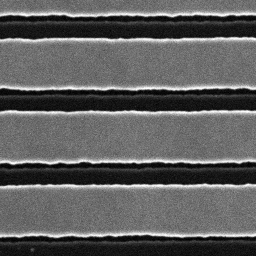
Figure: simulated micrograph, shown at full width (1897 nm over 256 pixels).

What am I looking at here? lines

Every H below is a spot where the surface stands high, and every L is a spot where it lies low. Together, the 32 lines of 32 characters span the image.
HHHHHHHHHHHHHHHHHHHHHHHHHHHHHHHH
HHHHHHHHHHHHHHHHHHHHHHHHHHHHHHHH
LLLLLLLLLLLLLLLLLLLLLLLLLLLLLLLL
LLLLLLLLLLLLLLLLLLLLLLLLLLLLLLLL
LLLLLLLLLLLLLLLLLLLLLLLLLLLLLLLL
HHHHHHHHHHHHHHHHHHHHHHHHHHHHHHHH
HHHHHHHHHHHHHHHHHHHHHHHHHHHHHHHH
HHHHHHHHHHHHHHHHHHHHHHHHHHHHHHHH
HHHHHHHHHHHHHHHHHHHHHHHHHHHHHHHH
HHHHHHHHHHHHHHHHHHHHHHHHHHHHHHHH
HHHHHHHHHHHHHHHHHHHHHHHHHHHHHHHH
LLLLLLLLLLLLLLLLLLLLLLLLLLLLLLLL
LLLLLLLLLLLLLLLLLLLLLLLLLLLLLLLL
LLLLLLLLLLLLLLLLLLLLLLLLLLLLLLLL
HHHHHHHHHHHHHHHHHHHHHHHHHHHHHHHH
HHHHHHHHHHHHHHHHHHHHHHHHHHHHHHHH
HHHHHHHHHHHHHHHHHHHHHHHHHHHHHHHH
HHHHHHHHHHHHHHHHHHHHHHHHHHHHHHHH
HHHHHHHHHHHHHHHHHHHHHHHHHHHHHHHH
HHHHHHHHHHHHHHHHHHHHHHHHHHHHHHHH
LLLLLLLLLLLLLLLLLLLLLLLLLLLLLLLL
LLLLLLLLLLLLLLLLLLLLLLLLLLLLLLLL
LLLLLLLLLLLLLLLLLLLLLLLLLLLLLLLL
HHHHHHHHHHHHHHHHHHHHHHHHHHHHHHHH
HHHHHHHHHHHHHHHHHHHHHHHHHHHHHHHH
HHHHHHHHHHHHHHHHHHHHHHHHHHHHHHHH
HHHHHHHHHHHHHHHHHHHHHHHHHHHHHHHH
HHHHHHHHHHHHHHHHHHHHHHHHHHHHHHHH
HHHHHHHHHHHHHHHHHHHHHHHHHHHHHHHH
HHHHHLHHHHHHHLHLLLLLHHHHHHHHHHHH
LLLLLLLLLLLLLLLLLLLLLLLLLLLLLLLL
LLLLLLLLLLLLLLLLLLLLLLLLLLLLLLLL